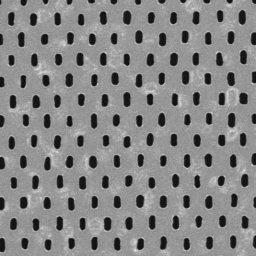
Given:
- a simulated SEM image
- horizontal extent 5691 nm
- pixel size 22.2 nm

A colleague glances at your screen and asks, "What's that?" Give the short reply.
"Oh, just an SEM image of a regular array of holes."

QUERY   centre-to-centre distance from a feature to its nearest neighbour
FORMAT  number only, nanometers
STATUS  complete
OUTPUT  496